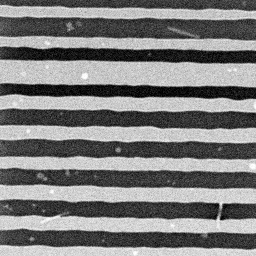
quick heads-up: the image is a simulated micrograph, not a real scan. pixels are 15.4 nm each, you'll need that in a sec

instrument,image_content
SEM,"groups of lines, slits or small figures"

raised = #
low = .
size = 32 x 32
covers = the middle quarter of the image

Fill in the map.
################################
################################
################################
################################
################################
................................
................................
................................
##################..############
################################
################################
.............##...######..####..
................................
................................
................................
................................
################################
################################
################################
................................
................................
................................
................................
.######...######.###............
################################
################################
.............................###
................................
................................
................................
................................
################################